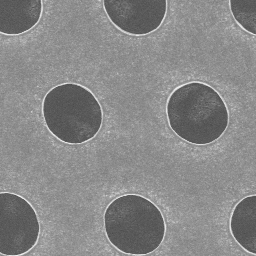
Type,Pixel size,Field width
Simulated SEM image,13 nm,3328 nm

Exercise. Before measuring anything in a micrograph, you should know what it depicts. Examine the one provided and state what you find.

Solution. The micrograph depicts holes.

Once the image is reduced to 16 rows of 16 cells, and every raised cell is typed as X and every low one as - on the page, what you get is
---XXXX---XXXX--
--XXXXX---XXXXX-
XXXXXXXXXXXXXXXX
XXXXXXXXXXXXXXXX
XXXXXXXXXXXXXXXX
XXX--XXXXXX--XXX
XXX---XXXX----XX
XXX---XXXXX---XX
XXXX--XXXXX---XX
XXXXXXXXXXXXXXXX
XXXXXXXXXXXXXXXX
XXXXXXXXXXXXXXXX
-XXXXXX--XXXXXX-
--XXXXX---XXXXX-
--XXXXX---XXXXX-
--XXXXX---XXXXX-